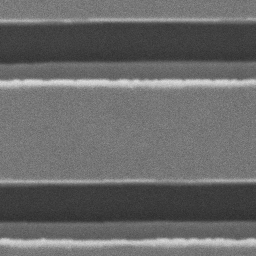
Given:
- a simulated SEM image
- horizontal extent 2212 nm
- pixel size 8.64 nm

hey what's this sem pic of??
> lines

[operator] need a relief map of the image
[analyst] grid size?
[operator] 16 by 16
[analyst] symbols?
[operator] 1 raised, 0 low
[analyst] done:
1111111111111111
0000000000000000
0000000000000000
0000000000000000
1111111111111111
1111111111111111
1111111111111111
1111111111111111
1111111111111111
1111111111111111
1111111111111111
0000000000000000
0000000000000000
0000000000000000
1111111111111111
1111111111111111